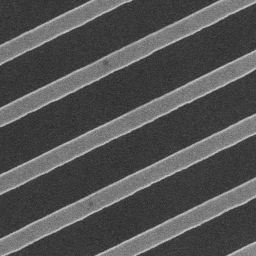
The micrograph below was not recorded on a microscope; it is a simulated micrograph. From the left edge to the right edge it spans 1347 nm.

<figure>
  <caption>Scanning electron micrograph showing lines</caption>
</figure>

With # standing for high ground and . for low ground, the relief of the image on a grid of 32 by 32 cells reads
...........####............#####
........#####............#####..
......#####...........#####.....
....######...........#####......
..#####...........#####.........
#####...........#####...........
###...........#####............#
#...........#####............###
..........#####............#####
........#####............#####..
......#####............#####....
....#####............#####......
..#####............#####........
#####............#####..........
###............#####...........#
#............#####...........###
...........#####...........#####
.........#####...........#####..
.......#####...........#####....
.....#####...........#####......
...#####...........#####........
.#####...........#####..........
####...........#####...........#
##...........#####...........###
...........#####...........#####
.........#####...........#####..
.......#####...........#####....
.....#####...........#####......
...#####...........#####........
.#####...........#####..........
####...........#####...........#
##...........#####...........###